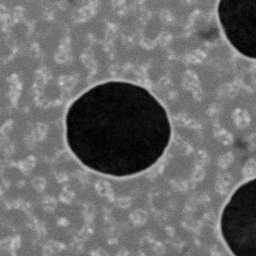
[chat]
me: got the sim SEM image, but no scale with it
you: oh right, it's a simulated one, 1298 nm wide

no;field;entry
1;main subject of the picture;holes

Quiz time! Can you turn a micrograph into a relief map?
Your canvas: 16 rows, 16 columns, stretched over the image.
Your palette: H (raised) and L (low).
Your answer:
HHHHHHHHHHHHHHLL
HHHHHHHHHHHHHHLL
HHHHHHHHHHHHHHLL
HHHHHHHHHHHHHHHL
HHHHHHHHHHHHHHHH
HHHHHHLLLHHHHHHH
HHHHHLLLLLHHHHHH
HHHHLLLLLLLHHHHH
HHHHLLLLLLLHHHHH
HHHHHLLLLLHHHHHH
HHHHHHLLLHHHHHHH
HHHHHHHHHHHHHHHL
HHHHHHHHHHHHHHLL
HHHHHHHHHHHHHHLL
HHHHHHHHHHHHHHLL
HHHHHHHHHHHHHHLL